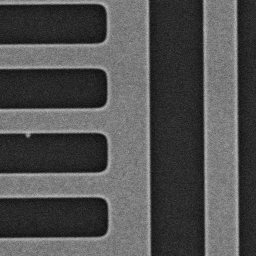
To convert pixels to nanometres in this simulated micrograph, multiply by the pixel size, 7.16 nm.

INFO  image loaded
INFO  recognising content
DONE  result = groups of lines, slits or small figures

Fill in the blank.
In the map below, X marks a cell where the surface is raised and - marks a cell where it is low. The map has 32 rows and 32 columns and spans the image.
-------------XXXXXX-------XXX---
-------------XXXXXX-------XXX---
--------------XXXXX-------XXX---
--------------XXXXX-------XXXX--
-------------XXXXXX-------XXXX--
------------XXXXXXX-------XXXX--
XXXXXXXXXXXXXXXXXXX-------XXXX--
XXXXXXXXXXXXXXXXXXX-------XXXX--
------------XXXXXXX-------XXXX--
-------------XXXXXX-------XXXX--
--------------XXXXX-------XXXX--
--------------XXXXX-------XXXX--
-------------XXXXXX-------XXXX--
-------------XXXXXX-------XXXX--
XXXXXXXXXXXXXXXXXXX-------XXXX--
XXXXXXXXXXXXXXXXXXX-------XXXX--
------------XXXXXXX-------XXXX--
-------------XXXXXX-------XXXX--
--------------XXXXX-------XXXX--
--------------XXXXX-------XXXX--
--------------XXXXX-------XXXX--
-------------XXXXXX-------XXXX--
XXXXXXXXXXXXXXXXXXX-------XXXX--
XXXXXXXXXXXXXXXXXXX-------XXXX--
XXXXXXXXXXXXXXXXXXX-------XXXX--
--------------XXXXX-------XXXX--
--------------XXXXX-------XXXX--
--------------XXXXX-------XXXX--
--------------XXXXX-------XXXX--
-------------XXXXXX-------XXXX--
XXXXXXXXXXXXXXXXXXX-------XXXX--
XXXXXXXXXXXXXXXXXXX-------XXXX--